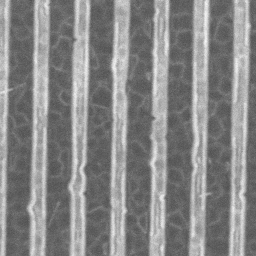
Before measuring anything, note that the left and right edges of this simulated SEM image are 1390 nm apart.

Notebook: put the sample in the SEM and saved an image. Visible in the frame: parallel lines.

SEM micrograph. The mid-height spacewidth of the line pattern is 26.4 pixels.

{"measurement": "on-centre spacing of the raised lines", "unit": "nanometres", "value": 217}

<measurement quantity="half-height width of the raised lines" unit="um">0.072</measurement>